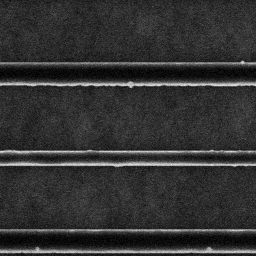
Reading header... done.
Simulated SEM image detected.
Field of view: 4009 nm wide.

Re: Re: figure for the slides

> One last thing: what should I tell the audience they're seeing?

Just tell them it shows lines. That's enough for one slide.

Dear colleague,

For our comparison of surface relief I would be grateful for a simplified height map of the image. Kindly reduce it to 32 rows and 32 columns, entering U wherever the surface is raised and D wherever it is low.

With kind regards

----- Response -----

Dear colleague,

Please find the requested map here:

DDDDDDDDDDDDDDDDDDDDDDDDDDDDDDDD
DDDDDDDDDDDDDDDDDDDDDDDDDDDDDDDD
DDDDDDDDDDDDDDDDDDDDDDDDDDDDDDDD
DDDDDDDDDDDDDDDDDDDDDDDDDDDDDDDD
DDDDDDDDDDDDDDDDDDDDDDDDDDDDDDDD
DDDDDDDDDDDDDDDDDDDDDDDDDDDDDDDD
DDDDDDDDDDDDDDDDDDDDDDDDDDDDDDDD
DDDDDDDDDDDDDDDDDDDDDDDDDDDDDDDD
UUUUUUUUUUUUUUUUUUUUUUUUUUUUUUUU
UUUUUUUUUUUUUUUUUUUUUUUUUUUUUUUU
UUUUUUUUUUUUUUUUUUUUUUUUUUUUUUUU
DDDDDDDDDDDDDDDDDDDDDDDDDDDDDDDD
DDDDDDDDDDDDDDDDDDDDDDDDDDDDDDDD
DDDDDDDDDDDDDDDDDDDDDDDDDDDDDDDD
DDDDDDDDDDDDDDDDDDDDDDDDDDDDDDDD
DDDDDDDDDDDDDDDDDDDDDDDDDDDDDDDD
DDDDDDDDDDDDDDDDDDDDDDDDDDDDDDDD
DDDDDDDDDDDDDDDDDDDDDDDDDDDDDDDD
DDDDDDDDDDDDDDDDDDDDDDDDDDDDDDDD
UUUUUUUUUUUUUUUUUUUUUUUUUUUUUUUU
UUUUUUUUUUUUUUUUUUUUUUUUUUUUUUUU
DDDDDDDDDDDDDDDDDDDDDDDDDDDDDDDD
DDDDDDDDDDDDDDDDDDDDDDDDDDDDDDDD
DDDDDDDDDDDDDDDDDDDDDDDDDDDDDDDD
DDDDDDDDDDDDDDDDDDDDDDDDDDDDDDDD
DDDDDDDDDDDDDDDDDDDDDDDDDDDDDDDD
DDDDDDDDDDDDDDDDDDDDDDDDDDDDDDDD
DDDDDDDDDDDDDDDDDDDDDDDDDDDDDDDD
DDDDDDDDDDDDDDDDDDDDDDDDDDDDDDDD
UUUUUUUUUUUUUUUUUUUUUUUUUUUUUUUU
UUUUUUUUUUUUUUUUUUUUUUUUUUUUUUUU
UUUUUUUUUUUUUUUUUUUUUUUUUUUUUUUU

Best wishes